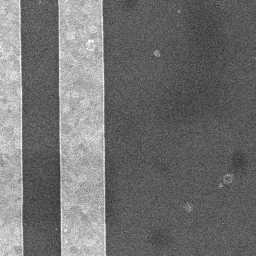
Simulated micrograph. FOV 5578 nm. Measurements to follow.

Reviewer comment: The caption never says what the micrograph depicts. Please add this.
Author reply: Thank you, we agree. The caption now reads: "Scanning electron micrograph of wiring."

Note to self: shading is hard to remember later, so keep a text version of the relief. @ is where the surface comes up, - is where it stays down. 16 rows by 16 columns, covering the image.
@---@@----------
@---@@----------
@---@@----------
@---@@----------
@---@@----------
@---@@----------
@---@@----------
@---@@----------
@---@@----------
@---@@----------
@---@@----------
@---@@@---------
@---@@@---------
@---@@@---------
@---@@@---------
@---@@@---------